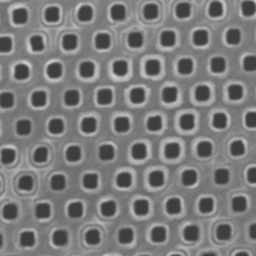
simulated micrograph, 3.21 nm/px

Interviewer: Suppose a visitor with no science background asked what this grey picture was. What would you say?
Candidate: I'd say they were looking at a regular array of holes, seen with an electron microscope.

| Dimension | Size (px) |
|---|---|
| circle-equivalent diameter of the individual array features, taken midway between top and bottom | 16.1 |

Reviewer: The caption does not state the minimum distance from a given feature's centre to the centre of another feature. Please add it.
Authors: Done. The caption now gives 0.103 µm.